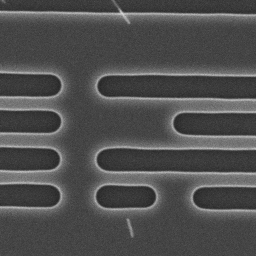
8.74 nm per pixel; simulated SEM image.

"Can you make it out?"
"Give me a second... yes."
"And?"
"groups of lines, slits or small figures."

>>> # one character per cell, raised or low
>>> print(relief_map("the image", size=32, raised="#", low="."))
................................
####............................
################################
################################
################################
################################
################################
################################
################################
.......######...................
........####....................
.......#####....................
################################
################################
.......###############..........
........##############..........
.......###############..........
################################
......########...###############
.......#####....................
.......#####....................
##############..................
################################
.......#####.......######.......
........####........####........
.......#####.......#####........
################################
################################
################################
################################
################################
################################